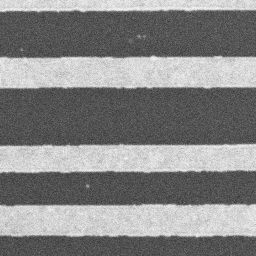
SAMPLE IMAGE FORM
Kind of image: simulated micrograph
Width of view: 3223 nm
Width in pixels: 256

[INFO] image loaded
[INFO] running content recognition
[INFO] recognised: lines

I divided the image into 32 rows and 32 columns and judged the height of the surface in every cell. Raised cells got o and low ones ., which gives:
oooooooooooooooooooooooooooooooo
................................
................................
................................
................................
................................
................................
oooooooooooooooooooooooooooooooo
oooooooooooooooooooooooooooooooo
oooooooooooooooooooooooooooooooo
oooooooooooooooooooooooooooooooo
................................
................................
................................
................................
................................
................................
................................
oooooooooooooooooooooooooooooooo
oooooooooooooooooooooooooooooooo
oooooooooooooooooooooooooooooooo
................................
................................
................................
................................
................................
oooooooooooooooooooooooooooooooo
oooooooooooooooooooooooooooooooo
oooooooooooooooooooooooooooooooo
................................
................................
................................